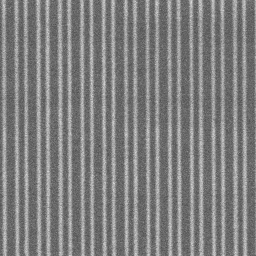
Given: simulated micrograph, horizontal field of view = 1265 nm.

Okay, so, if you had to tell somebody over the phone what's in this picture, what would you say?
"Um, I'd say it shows parallel lines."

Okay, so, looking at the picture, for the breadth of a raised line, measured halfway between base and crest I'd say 0.013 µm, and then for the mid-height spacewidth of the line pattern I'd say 9.37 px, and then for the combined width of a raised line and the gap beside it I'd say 53.9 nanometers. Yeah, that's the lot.